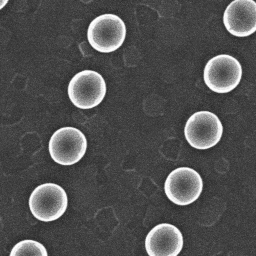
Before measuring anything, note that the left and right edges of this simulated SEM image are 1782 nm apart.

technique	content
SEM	raised bodies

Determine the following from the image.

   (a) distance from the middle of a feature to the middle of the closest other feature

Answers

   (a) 414 nm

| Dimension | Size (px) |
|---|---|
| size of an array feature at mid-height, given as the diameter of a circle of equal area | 36.3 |